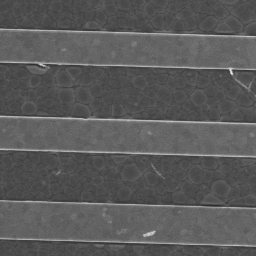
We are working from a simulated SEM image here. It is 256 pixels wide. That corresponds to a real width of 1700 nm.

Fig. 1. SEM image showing one or a few lines or trenches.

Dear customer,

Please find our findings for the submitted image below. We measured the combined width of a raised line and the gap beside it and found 577 nanometers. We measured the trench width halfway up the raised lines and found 338 nanometres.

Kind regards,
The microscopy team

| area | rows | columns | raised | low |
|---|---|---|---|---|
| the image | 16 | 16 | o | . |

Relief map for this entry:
................
................
oooooooooooooooo
oooooooooooooooo
................
................
................
ooooooo.........
oooooooooooooooo
......oooooooooo
................
................
................
oooooooooooooooo
oooooooooooooooo
................